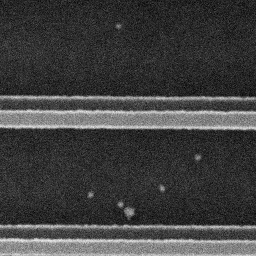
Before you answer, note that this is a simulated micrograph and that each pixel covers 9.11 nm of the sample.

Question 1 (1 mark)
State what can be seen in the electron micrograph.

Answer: lines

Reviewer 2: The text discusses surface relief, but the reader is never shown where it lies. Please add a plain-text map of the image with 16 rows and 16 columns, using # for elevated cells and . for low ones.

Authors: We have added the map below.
................
................
................
................
................
................
################
################
................
................
................
................
................
................
################
################